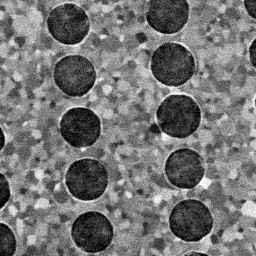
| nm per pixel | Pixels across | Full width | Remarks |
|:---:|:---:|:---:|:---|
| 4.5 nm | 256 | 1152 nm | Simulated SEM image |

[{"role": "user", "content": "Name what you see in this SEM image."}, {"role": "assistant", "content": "a regular array of holes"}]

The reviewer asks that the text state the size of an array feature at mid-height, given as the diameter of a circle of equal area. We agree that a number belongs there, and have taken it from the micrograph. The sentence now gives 193 nm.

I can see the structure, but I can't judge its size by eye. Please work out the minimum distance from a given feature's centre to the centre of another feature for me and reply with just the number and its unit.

52.2 px